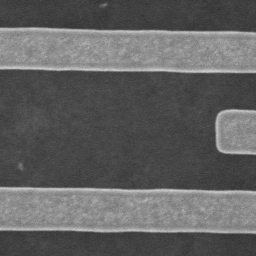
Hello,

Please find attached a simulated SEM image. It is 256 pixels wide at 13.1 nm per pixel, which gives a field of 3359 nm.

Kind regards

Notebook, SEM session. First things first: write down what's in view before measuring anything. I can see wiring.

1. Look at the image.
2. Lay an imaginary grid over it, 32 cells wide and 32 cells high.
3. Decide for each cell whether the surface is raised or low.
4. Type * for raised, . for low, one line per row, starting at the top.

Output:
................................
................................
................................
................................
********************************
********************************
********************************
********************************
********************************
................................
................................
................................
................................
................................
...........................*****
...........................*****
...........................*****
...........................*****
...........................*****
................................
................................
................................
................................
****............................
********************************
********************************
********************************
********************************
********************************
................................
................................
................................